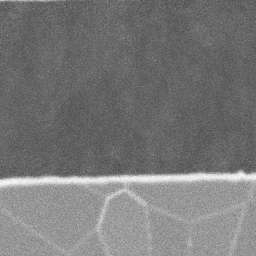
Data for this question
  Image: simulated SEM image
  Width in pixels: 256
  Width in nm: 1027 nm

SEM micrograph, one or a few lines or trenches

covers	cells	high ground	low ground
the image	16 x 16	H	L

LLLLLLLLLLLLLLLL
LLLLLLLLLLLLLLLL
LLLLLLLLLLLLLLLL
LLLLLLLLLLLLLLLL
LLLLLLLLLLLLLLLL
LLLLLLLLLLLLLLLL
LLLLLLLLLLLLLLLL
LLLLLLLLLLLLLLLL
LLLLLLLLLLLLLLLL
LLLLLLLLLLLLLLLL
LLLLLLLLLLLLLLLL
HHHHHHHHHHHHHHHH
HHHHHHHHHHHHHHHH
HHHHHHHHHHHHHHHH
HHHHHHHHHHHHHHHH
HHHHHHHHHHHHHHHH